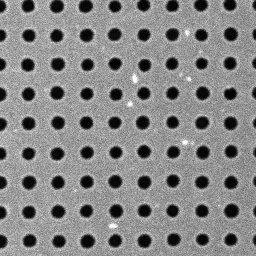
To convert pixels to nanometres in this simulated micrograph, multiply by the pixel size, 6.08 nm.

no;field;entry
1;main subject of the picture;a regular array of holes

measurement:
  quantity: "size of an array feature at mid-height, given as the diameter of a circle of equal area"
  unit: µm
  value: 0.077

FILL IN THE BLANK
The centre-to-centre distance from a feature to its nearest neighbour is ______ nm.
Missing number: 172